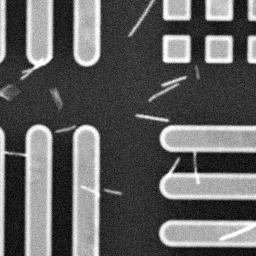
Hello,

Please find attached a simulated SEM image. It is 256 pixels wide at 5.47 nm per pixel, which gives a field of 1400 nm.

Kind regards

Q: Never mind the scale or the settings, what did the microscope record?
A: groups of lines, slits or small figures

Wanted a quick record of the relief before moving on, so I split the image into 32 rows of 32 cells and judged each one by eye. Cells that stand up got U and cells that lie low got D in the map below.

UDDDUUDDDUUUDDDDDDDDDUUUDDUUUDDU
UDDDUUDDDUUUDDDDDDDDDUUUDDUUUDDU
UDDDUUDDDUUUDDDDDDDDDDDDDDDDDDDD
UDDDUUDDDUUUDDDDDDDDDDDDDDDDDDDD
UDDDUUDDDUUUDDDDDDDDDDDDDDDDDDDD
UDDDUUDDDUUUDDDDDDDDDUUUDDUUUDDU
DDDDUUDDDUUUDDDDDDDDDUUUDDUUUDDU
DDDDUUDDDDUUDDDDDDDDDUUDDDUUUDDU
DDDDDDDDDDDDDDDDDDDDDDDDDDDDDDDD
DDDDDDDDDDDDDDDDDDDDDDDDDDDDDDDD
DDDDDDDDDDDDDDDDDDDDDDDDDDDDDDDD
DDDDDDDDDDDDDDDDDDDDDDDDDDDDDDDD
DDDDDDDDDDDDDDDDDDDDDDDDDDDDDDDD
DDDDDDDDDDDDDDDDDDDDDDDDDDDDDDDD
DDDDDDDDDDDDDDDDDDDDDDDDDDDDDDDD
DDDDDDDDDDDDDDDDDDDDDDDDDDDDDDDD
DDDDUUDDDDUUDDDDDDDDDUUUUUUUUUUU
DDDUUUDDDUUUDDDDDDDDUUUUUUUUUUUU
DDDUUUDDDUUUDDDDDDDDDUUUUUUUUUUU
DDDUUUDDDUUUDDDDDDDDDDDDDDDDDDDD
DDDUUUDDDUUUDDDDDDDDDDDDDDDDDDDD
DDDUUUDDDUUUDDDDDDDDDDDDDDDDDDDD
DDDUUUDDDUUUDDDDDDDDUUUUUUUUUUUU
DDDUUUDDDUUUDDDDDDDDUUUUUUUUUUUU
DDDUUUDDDUUUDDDDDDDDDUUUUUUUUUUU
DDDUUUDDDUUUDDDDDDDDDDDDDDDDDDDD
DDDUUUDDDUUUDDDDDDDDDDDDDDDDDDDD
DDDUUUDDDUUUDDDDDDDDDDDDDDDDDDDD
DDDUUUDDDUUUDDDDDDDDUUUUUUUUUUUU
DDDUUUDDDUUUDDDDDDDDUUUUUUUUUUUU
DDDUUUDDDUUUDDDDDDDDDUUUUUUUUUUU
DDDUUUDDDUUUDDDDDDDDDDDDDDDDDDDD